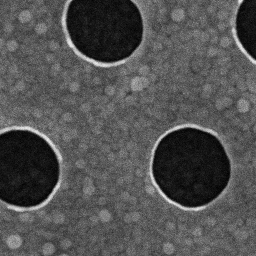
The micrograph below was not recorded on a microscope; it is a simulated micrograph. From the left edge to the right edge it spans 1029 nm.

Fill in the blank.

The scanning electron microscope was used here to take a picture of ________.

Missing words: holes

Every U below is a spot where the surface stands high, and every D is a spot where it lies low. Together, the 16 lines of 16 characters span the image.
UUUUDDDDDUUUUUUD
UUUUDDDDDUUUUUUD
UUUUDDDDDUUUUUUD
UUUUUDDDUUUUUUUU
UUUUUUUUUUUUUUUU
UUUUUUUUUUUUUUUU
UUUUUUUUUUUUUUUU
UUUUUUUUUUUUUUUU
DDUUUUUUUUDDDUUU
DDDUUUUUUUDDDDUU
DDDDUUUUUUDDDDUU
DDDDUUUUUUDDDDUU
DDDUUUUUUUUDDUUU
UUUUUUUUUUUUUUUU
UUUUUUUUUUUUUUUU
UUUUUUUUUUUUUUUU